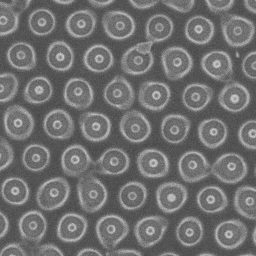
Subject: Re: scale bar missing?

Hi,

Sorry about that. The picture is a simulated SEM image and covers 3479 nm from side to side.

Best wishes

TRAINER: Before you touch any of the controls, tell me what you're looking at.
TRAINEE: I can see an array of small figures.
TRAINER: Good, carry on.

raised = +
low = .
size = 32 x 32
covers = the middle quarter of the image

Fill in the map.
.+++++.....++++......++++......+
+++++++...++++++....++++++.....+
++++++++++++++++++++++++++....++
++++++++++++++++++++++++++++++++
++...+++++++...+++++++++++++++++
+.....+++++.....++++.....+++++++
...+...++++..+...+++......+++++.
...+...+++...+...++...++..++++..
+......++++......++....+..++++..
+.....++++++....++++.....+++++..
++++.+++++++++.++++++...+++++++.
++++++++++++++++++++++++++++++++
+++++++++++++++++.++++++++++++++
.++++.....+++++.....++++++...+++
.++++......++++.....+++++......+
..+++..++..+++...++..++++......+
..+++......++++..++..++++..++..+
.++++......++++......++++.....++
++++++....++++++....+++++.....++
+++++++++++++++++++++++++++.++++
++++++++++++++++++++++++++++++++
+....+++++++.+++++++++++++++++++
......++++.....+++++....+++++++.
..+...++++......+++......+++++..
..+...+++...+...+++...+...+++...
.......++.......+++.......+++..+
......++++.....++++......++++...
+++.++++++++++++++++.....+++++..
++++++++++++++++++++++++++++++..
+++++....+++++++++++++++++++++++
.+++......++++++...++++++....+++
.+++......+++++.....++++......++